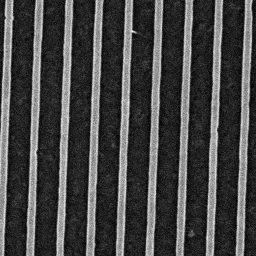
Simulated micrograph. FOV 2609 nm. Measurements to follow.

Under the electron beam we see parallel lines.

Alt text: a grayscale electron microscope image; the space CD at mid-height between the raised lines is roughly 233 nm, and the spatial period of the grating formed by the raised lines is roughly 305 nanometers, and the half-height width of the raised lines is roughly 0.0687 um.